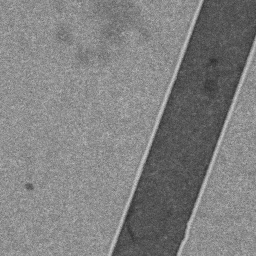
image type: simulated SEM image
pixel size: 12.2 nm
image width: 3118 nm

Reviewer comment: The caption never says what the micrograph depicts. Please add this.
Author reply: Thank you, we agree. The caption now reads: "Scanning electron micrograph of one or a few lines or trenches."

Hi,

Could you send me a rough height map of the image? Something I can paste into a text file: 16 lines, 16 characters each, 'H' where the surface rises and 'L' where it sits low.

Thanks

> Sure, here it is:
HHHHHHHHHHHHLLLL
HHHHHHHHHHHHLLLL
HHHHHHHHHHHHLLLL
HHHHHHHHHHHLLLLL
HHHHHHHHHHHLLLLH
HHHHHHHHHHHLLLLH
HHHHHHHHHHLLLLLH
HHHHHHHHHHLLLLHH
HHHHHHHHHHLLLLHH
HHHHHHHHHLLLLLHH
HHHHHHHHHLLLLHHH
HHHHHHHHLLLLLHHH
HHHHHHHHLLLLHHHH
HHHHHHHHLLLLHHHH
HHHHHHHLLLLLHHHH
HHHHHHHLLLLHHHHH